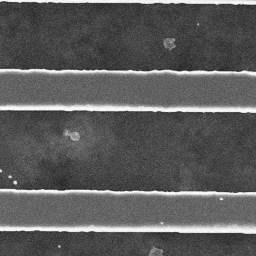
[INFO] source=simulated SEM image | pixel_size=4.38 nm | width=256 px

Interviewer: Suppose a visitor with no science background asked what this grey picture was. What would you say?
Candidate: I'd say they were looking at lines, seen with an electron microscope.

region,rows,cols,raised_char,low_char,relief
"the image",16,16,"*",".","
................
................
................
................
**************.*
****************
****************
................
................
................
................
................
****************
****************
...........*****
................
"